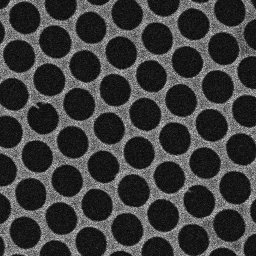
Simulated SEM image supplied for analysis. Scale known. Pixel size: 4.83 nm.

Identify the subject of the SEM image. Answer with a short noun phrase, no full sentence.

a regular array of holes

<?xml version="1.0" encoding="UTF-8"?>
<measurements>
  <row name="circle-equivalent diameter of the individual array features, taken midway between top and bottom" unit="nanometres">155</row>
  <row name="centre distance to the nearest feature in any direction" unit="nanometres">185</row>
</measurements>